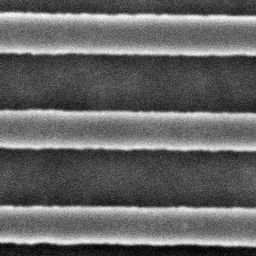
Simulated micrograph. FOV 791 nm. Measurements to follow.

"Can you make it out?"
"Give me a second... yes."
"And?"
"lines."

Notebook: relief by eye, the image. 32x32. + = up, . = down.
................................
................................
++++++++++++++++++++++++++++++++
++++++++++++++++++++++++++++++++
++++++++++++++++++++++++++++++++
++++++++++++++++++++++++++++++++
++++++++++++++++++++++++++++++++
................................
................................
................................
................................
................................
................................
................................
++++++++++++++++++++++++++++++++
++++++++++++++++++++++++++++++++
++++++++++++++++++++++++++++++++
++++++++++++++++++++++++++++++++
....++...+++++++++++++++++++++++
................................
................................
................................
................................
................................
................................
................................
++++++++++++++++++++++++++++++++
++++++++++++++++++++++++++++++++
++++++++++++++++++++++++++++++++
++++++++++++++++++++++++++++++++
................+.++++..++++++++
................................